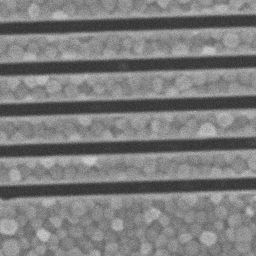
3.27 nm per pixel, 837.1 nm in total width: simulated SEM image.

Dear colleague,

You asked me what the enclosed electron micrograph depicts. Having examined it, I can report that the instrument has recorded parallel lines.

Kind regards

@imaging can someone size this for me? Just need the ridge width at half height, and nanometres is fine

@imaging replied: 88.6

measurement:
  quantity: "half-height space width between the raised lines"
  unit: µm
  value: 0.0425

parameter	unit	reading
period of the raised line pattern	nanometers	134